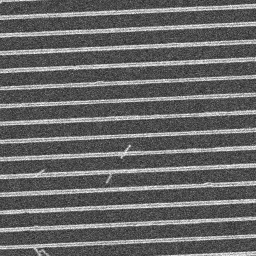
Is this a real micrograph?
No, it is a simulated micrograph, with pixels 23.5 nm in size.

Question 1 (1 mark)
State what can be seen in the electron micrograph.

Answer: parallel lines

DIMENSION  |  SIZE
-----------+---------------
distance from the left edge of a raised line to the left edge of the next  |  17.7 pixels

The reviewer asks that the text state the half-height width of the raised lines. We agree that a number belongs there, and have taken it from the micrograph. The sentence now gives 61.5 nanometers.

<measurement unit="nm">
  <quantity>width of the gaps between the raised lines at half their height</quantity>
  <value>355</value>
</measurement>